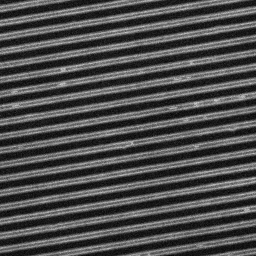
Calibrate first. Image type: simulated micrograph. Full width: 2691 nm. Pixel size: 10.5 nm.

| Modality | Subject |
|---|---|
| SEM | parallel lines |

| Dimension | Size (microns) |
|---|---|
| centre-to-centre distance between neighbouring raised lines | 0.147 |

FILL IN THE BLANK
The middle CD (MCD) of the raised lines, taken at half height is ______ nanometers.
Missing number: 58.3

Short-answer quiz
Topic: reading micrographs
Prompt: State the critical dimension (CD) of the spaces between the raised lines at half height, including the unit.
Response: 88.1 nm